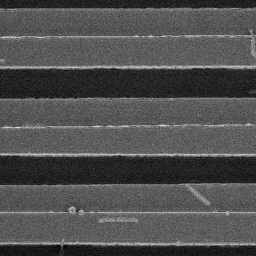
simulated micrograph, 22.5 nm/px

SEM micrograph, lines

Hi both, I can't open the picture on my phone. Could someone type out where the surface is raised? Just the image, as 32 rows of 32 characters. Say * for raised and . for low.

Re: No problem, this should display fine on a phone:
................................
********************************
********************************
********************************
********************************
********************************
********************************
********************************
................................
................................
................................
................................
********************************
********************************
********************************
********************************
********************************
********************************
********************************
................................
................................
................................
................................
********************************
********************************
********************************
********************************
********************************
********************************
********************************
...**..*************************
................................